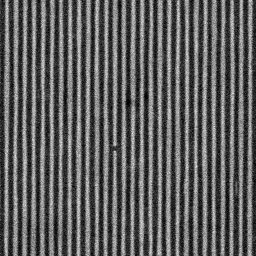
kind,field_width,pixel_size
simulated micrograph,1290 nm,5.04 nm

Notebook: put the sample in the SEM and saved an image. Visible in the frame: parallel lines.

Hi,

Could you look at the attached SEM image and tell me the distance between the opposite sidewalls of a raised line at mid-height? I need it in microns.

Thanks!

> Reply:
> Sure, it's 0.0183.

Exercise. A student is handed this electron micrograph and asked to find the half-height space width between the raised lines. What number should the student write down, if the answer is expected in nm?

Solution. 27.1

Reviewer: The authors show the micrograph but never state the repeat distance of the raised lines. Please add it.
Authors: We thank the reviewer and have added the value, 45.4 nm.